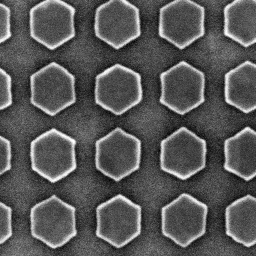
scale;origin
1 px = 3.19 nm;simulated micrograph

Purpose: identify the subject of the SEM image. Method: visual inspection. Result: a regular array of raised bodies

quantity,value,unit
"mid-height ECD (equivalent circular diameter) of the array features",0.149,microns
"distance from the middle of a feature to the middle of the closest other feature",209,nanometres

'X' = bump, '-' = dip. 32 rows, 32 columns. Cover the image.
-----XXX-----XXX-----XXXX----XXX
X---XXXXX---XXXXX---XXXXX---XXXX
X---XXXXX---XXXXX---XXXXX---XXXX
X---XXXXX---XXXXX---XXXXX---XXXX
X---XXXXX---XXXXX---XXXXX----XXX
-----XXX------XX------XX------X-
--------------------------------
--------------------------------
-----XXX------XX------XX-----XXX
X---XXXXX---XXXXX---XXXXX---XXXX
X---XXXXX---XXXXX---XXXXXX--XXXX
X---XXXXX---XXXXXX--XXXXX---XXXX
X---XXXXX---XXXXX---XXXXX---XXXX
-----XXX-----XXX-----XXX------XX
--------------------------------
--------------------------------
------X-------XX------XX------XX
X---XXXXX----XXXX----XXXX---XXXX
X---XXXXX---XXXXX---XXXXXX--XXXX
X---XXXXX---XXXXX---XXXXXX--XXXX
X---XXXXX---XXXXX---XXXXXX--XXXX
-----XXXX----XXX-----XXX-----XXX
------X-------------------------
--------------------------------
-----------------------X--------
-----XXX-----XXXX----XXXX----XXX
X---XXXXX---XXXXXX--XXXXXX--XXXX
X---XXXXX---XXXXX---XXXXXX--XXXX
X---XXXXX---XXXXX---XXXXXX--XXXX
X---XXXXX---XXXXX----XXXX----XXX
------XX------XX------XX------XX
--------------------------------